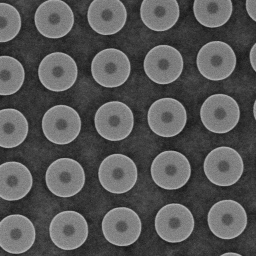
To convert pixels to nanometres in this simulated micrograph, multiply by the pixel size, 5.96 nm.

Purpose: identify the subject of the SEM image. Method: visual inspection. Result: an array of small figures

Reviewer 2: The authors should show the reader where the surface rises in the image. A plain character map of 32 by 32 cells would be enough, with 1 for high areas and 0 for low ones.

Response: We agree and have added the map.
10000111000111100011110011111001
11000111100111110011110011111001
11101111100111110011110001110000
11100111100011100001100000000000
11000011000000000000000000000000
00000000000000000000000000110000
00000000000001100001110001111001
11000111100011110011111001111001
11100111110111110011111001111000
11100111110011110001110000111000
11100111100011100000000000000000
11000000000000000000000000000000
00000000000000000000110000111000
00000011100011110001111001111100
11100111110011111011111001111100
11100111110011111001111001111100
11100111110011110001110000010000
11100011100000100000000000000000
00000000000000000000000000011000
00000000000000110000111000111100
11100011110001111001111100111100
11110011110011111001111100111100
11110011111011111001111000111100
11110011110001110000110000000000
11100001100000000000000000000000
00000000000000000000010000011100
00000000100000111000111100111110
11110001111001111001111100111110
11110011111001111101111100111110
11110011111001111000111100011100
11110001110000110000000000000000
01100000000000000000000000000000